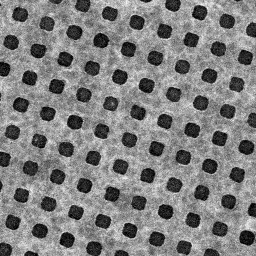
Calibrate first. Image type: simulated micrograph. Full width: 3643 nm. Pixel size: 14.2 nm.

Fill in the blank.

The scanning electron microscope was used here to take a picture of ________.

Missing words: a regular array of holes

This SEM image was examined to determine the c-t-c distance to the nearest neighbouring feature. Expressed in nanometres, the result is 402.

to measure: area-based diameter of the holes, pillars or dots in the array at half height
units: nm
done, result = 224